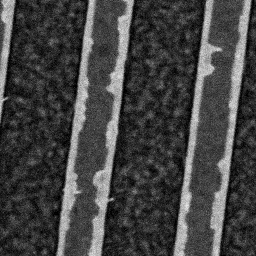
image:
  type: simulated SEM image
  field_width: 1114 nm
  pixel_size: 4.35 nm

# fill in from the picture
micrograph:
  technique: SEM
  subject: one or a few lines or trenches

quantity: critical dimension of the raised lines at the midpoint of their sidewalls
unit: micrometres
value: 0.175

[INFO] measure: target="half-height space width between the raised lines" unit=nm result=337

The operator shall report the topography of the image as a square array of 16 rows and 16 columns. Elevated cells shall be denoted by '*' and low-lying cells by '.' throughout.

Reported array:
*.....**.....***
*....***.....**.
*....***.....**.
.....***.....**.
.....***....***.
.....***....***.
.....**.....***.
.....**.....***.
.....**.....**..
....***.....**..
....***.....**..
....***.....**..
....***....***..
....**.....***..
....**.....***..
....**.....***..